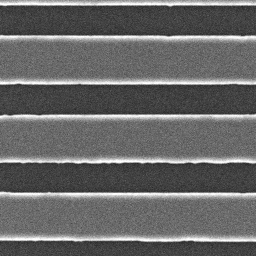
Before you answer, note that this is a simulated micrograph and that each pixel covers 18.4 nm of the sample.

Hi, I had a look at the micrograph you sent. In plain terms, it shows lines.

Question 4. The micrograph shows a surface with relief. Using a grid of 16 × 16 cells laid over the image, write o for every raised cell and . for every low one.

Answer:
................
................
oooooooooooooooo
oooooooooooooooo
oooooooooooooooo
................
................
oooooooooooooooo
oooooooooooooooo
oooooooooooooooo
................
................
oooooooooooooooo
oooooooooooooooo
oooooooooooooooo
................